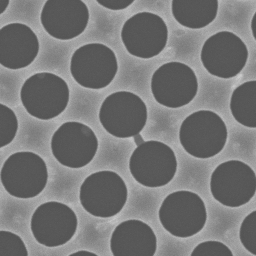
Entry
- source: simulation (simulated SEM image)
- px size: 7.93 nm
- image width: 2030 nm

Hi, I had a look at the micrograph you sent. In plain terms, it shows a regular array of holes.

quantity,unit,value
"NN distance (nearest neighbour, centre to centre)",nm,454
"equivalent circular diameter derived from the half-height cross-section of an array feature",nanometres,372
